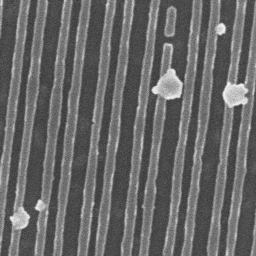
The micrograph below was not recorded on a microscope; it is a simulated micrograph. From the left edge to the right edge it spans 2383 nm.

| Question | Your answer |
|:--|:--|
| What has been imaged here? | parallel lines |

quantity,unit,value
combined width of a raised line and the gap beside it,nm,199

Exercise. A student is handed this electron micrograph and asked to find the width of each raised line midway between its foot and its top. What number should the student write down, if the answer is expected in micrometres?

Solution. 0.0798